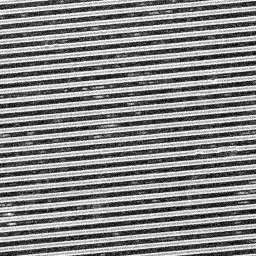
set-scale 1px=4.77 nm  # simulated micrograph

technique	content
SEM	parallel lines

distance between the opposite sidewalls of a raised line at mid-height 17.2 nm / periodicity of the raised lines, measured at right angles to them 0.0469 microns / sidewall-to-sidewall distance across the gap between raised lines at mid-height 29.6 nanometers